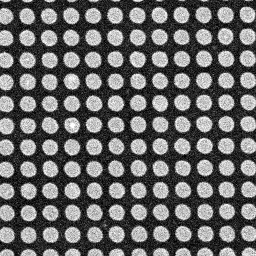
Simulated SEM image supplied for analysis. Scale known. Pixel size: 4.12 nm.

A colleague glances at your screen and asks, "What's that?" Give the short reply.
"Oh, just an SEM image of a regular array of raised bodies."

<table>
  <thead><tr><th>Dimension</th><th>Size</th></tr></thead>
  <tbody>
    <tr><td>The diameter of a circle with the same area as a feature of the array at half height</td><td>0.0632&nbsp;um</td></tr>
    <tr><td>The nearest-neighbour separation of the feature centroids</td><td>21.7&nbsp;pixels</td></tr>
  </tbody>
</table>